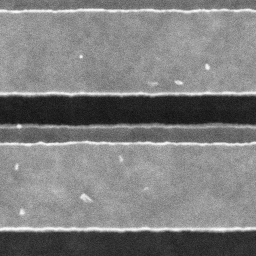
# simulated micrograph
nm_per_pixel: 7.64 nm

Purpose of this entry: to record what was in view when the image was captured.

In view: lines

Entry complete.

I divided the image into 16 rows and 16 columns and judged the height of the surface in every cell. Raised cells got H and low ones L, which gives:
HHHHHHHHHHHHHHHH
HHHHHHHHHHHHHHHH
HHHHHHHHHHHHHHHH
HHHHHHHHHHHHHHHH
HHHHHHHHHHHHHHHH
HHHHHHHHHHHHHHHH
LLLLLLLLLLLLLLLL
LLLLLLLLLLLLLLLL
HHHHHHHHHHHHHHHH
HHHHHHHHHHHHHHHH
HHHHHHHHHHHHHHHH
HHHHHHHHHHHHHHHH
HHHHHHHHHHHHHHHH
HHHHHHHHHHHHHHHH
LLLLLLLLLLLLLLLL
LLLLLLLLLLLLLLLL